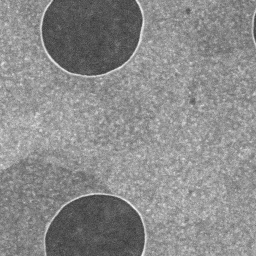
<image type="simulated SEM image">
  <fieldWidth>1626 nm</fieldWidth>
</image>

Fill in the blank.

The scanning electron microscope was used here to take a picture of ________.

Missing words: holes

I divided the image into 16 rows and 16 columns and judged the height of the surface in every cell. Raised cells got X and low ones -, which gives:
XXX------XXXXXXX
XXX------XXXXXXX
XXX------XXXXXXX
XXX-----XXXXXXXX
XXXX---XXXXXXXXX
XXXXXXXXXXXXXXXX
XXXXXXXXXXXXXXXX
XXXXXXXXXXXXXXXX
XXXXXXXXXXXXXXXX
XXXXXXXXXXXXXXXX
XXXXXXXXXXXXXXXX
XXXXXXXXXXXXXXXX
XXXXX---XXXXXXXX
XXX------XXXXXXX
XXX------XXXXXXX
XXX------XXXXXXX